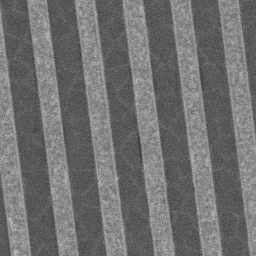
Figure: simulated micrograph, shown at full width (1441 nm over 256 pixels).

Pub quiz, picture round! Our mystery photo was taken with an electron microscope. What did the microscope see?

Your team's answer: parallel lines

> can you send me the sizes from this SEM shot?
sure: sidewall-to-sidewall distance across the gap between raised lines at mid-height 0.161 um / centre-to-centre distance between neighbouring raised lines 267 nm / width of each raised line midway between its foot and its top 107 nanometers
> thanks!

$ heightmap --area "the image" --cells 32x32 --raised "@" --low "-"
----@@----@@---@@@---@@@---@@@--
----@@----@@----@@----@@----@@--
----@@----@@----@@----@@----@@--
----@@----@@----@@----@@----@@--
----@@----@@----@@----@@----@@--
@---@@----@@----@@----@@----@@--
@---@@@---@@@---@@@---@@@---@@@-
@---@@@---@@@---@@@---@@@---@@@-
@----@@----@@---@@@---@@@---@@@-
@----@@----@@----@@----@@----@@-
@----@@----@@----@@----@@----@@-
@----@@----@@----@@----@@----@@-
@----@@----@@----@@----@@----@@-
@@---@@----@@----@@----@@----@@-
@@---@@@---@@@---@@@---@@@---@@@
@@---@@@---@@@---@@@---@@@---@@@
@@----@@----@@---@@@---@@@---@@@
@@----@@----@@----@@----@@----@@
@@----@@----@@----@@----@@----@@
@@----@@----@@----@@----@@----@@
@@----@@----@@----@@----@@----@@
@@@---@@----@@----@@----@@----@@
@@@---@@@---@@@---@@@---@@@---@@
@@@---@@@---@@@---@@@---@@@---@@
-@@----@@----@@---@@@---@@@---@@
-@@----@@----@@----@@----@@----@
-@@----@@----@@----@@----@@----@
-@@----@@----@@----@@----@@----@
-@@----@@----@@----@@----@@----@
-@@@---@@----@@----@@----@@----@
-@@@---@@@---@@@---@@@---@@@---@
-@@@---@@@---@@@---@@@---@@@---@